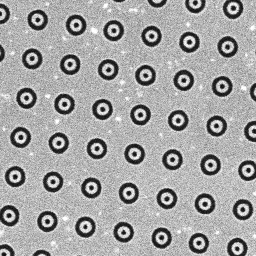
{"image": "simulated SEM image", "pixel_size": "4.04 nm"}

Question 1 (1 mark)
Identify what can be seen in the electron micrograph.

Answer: a regular array of ring-shaped grooves with a dot in the middle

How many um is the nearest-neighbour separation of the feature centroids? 0.154